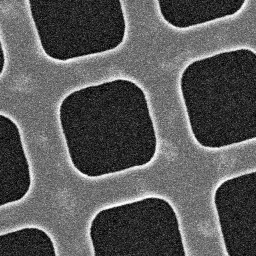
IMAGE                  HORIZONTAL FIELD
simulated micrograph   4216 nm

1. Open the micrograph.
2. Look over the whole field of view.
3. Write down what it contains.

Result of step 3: holes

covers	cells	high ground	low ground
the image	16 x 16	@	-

@@------@@-----@
@@------@@@--@@@
@@------@@@@@@@@
@@@--@@@@@@@@---
@@@@@@@@@@@-----
@@@@@----@@-----
@@@@-----@@@----
-@@@-----@@@----
-@@@------@@----
--@@------@@@@@@
--@@@---@@@@@@@@
--@@@@@@@@@@@@--
-@@@@@@@@-@@@---
@@@@@@-----@@@--
@--@@@-----@@@--
---@@@------@@--